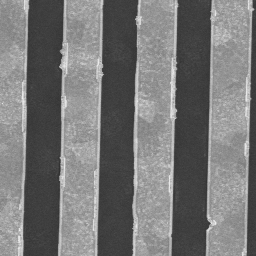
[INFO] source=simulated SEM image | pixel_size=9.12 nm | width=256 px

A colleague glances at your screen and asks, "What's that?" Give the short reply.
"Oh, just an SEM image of one or a few lines or trenches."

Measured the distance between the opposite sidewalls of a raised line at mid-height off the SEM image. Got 38.4 pixels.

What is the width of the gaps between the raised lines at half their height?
333 nm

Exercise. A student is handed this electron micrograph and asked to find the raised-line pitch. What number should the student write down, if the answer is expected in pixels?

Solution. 74.4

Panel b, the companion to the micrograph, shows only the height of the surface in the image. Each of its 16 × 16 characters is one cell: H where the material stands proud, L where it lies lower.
HHLLHHLLLHHLLHHH
HHLLHHLLLHHLLHHH
HHLLHHLLLHHLLHHH
HHLLHHLLLHHLLHHH
HHLLHHLLLHHLLHHH
HHLLHHLLHHHLLHHH
HHLLHHLLLHHLLHHH
HHLLHHLLHHHLLHHH
HHLLHHLLHHHLLHHH
HHLLHHLLLHHLLHHH
HHLLHHLLHHHLLHHL
HLLLHHLLHHHLLHHL
HLLLHHLLHHHLLHHL
HLLLHHLLHHHLLHHL
HLLLHHLLHHHLLHHL
HLLLHHLLHHHLLHHL